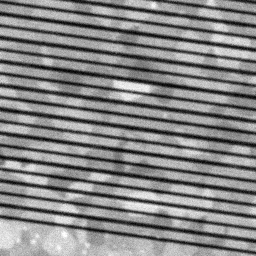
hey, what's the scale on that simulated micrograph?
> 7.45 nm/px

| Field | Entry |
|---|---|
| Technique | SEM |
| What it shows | parallel lines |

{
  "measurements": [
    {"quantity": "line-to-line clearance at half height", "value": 32.3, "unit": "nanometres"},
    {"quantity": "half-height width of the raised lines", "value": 57.1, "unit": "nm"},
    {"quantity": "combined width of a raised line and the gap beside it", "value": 88.2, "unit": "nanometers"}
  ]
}